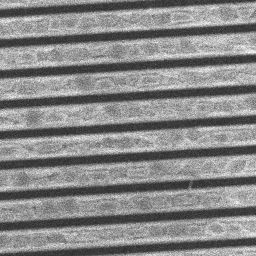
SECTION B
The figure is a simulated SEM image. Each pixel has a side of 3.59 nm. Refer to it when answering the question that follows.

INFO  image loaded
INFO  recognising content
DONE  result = parallel lines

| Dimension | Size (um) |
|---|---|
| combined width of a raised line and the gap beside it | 0.109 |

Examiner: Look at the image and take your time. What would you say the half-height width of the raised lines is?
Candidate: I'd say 71.6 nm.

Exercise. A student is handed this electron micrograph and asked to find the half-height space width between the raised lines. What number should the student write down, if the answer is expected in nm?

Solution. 35.8